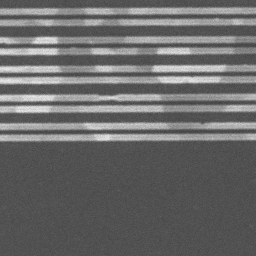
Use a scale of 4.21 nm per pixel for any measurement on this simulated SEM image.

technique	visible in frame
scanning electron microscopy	parallel lines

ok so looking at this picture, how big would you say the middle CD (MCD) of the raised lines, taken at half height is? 22.1 nanometers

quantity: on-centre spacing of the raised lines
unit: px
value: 14